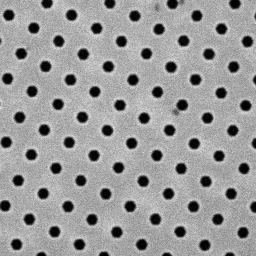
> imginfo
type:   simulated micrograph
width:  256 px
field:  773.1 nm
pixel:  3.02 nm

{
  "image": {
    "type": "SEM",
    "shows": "a regular array of holes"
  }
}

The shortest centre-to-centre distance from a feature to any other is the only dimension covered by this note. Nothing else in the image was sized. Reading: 83.5 nanometers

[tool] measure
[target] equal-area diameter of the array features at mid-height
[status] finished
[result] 33.2 nanometers